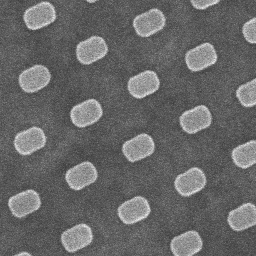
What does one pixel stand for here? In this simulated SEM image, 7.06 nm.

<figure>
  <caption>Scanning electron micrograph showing a regular array of raised bodies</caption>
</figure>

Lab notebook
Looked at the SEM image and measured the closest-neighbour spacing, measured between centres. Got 440 nm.